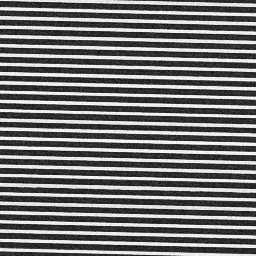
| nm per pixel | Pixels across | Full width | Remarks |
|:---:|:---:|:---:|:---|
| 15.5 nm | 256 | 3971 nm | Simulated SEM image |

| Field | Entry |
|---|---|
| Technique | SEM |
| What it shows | parallel lines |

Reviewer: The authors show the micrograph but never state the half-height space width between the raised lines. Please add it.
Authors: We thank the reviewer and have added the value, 96.9 nm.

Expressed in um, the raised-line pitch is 0.144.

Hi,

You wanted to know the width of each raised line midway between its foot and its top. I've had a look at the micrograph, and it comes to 40.7 nanometres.